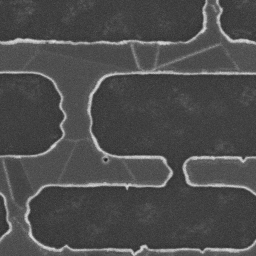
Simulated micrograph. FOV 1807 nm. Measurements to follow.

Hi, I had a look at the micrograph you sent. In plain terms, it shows one or a few lines or trenches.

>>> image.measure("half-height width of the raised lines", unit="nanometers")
229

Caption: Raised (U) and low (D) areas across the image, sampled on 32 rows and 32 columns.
DDDDDDDDDDDDDDDDDDDDDDDDDDUDDDDD
DDDDDDDDDDDDDDDDDDDDDDDDDUUUDDDD
DDDDDDDDDDDDDDDDDDDDDDDDDDUDDDDD
DDDDDDDDDDDDDDDDDDDDDDDDDUUUDDDD
DDDDDDDDDDDDDDDDDDDDDDDDUUUUDDDD
UUUUUUUUUUUUUUUUUUUUUUUUUUUUUUUU
UUUUUUUUUUUUUUUUUUUUUUUUUUUUUUUU
UUUUUUUUUUUUUUUUUUUUUUUUUUUUUUUU
UUUUUUUUUUUUUUUUUUUUUUUUUUUUUUUU
DDDDDDUUUUUUUUDDDDDDDDDDDDDDDDDD
DDDDDDDUUUUUDDDDDDDDDDDDDDDDDDDD
DDDDDDDUUUUUDDDDDDDDDDDDDDDDDDDD
DDDDDDDDUUUDDDDDDDDDDDDDDDDDDDDD
DDDDDDDDUUUDDDDDDDDDDDDDDDDDDDDD
DDDDDDDDUUUDDDDDDDDDDDDDDDDDDDDD
DDDDDDDDUUUDDDDDDDDDDDDDDDDDDDDD
DDDDDDDDUUUDDDDDDDDDDDDDDDDDDDDD
DDDDDDDUUUUUDDDDDDDDDDDDDDDDDDDD
DDDDDDUUUUUUDDDDDDDDDDDDDDDDDDDD
UUUUUUUUUUUUUUDDDDDDDDDDDDDDDDDD
UUUUUUUUUUUUUUUUUUUUUDDUUUUUUUUU
UUUUUUUUUUUUUUUUUUUUUDDUUUUUUUUU
UUUUUUUUUUUUUUUUUUUUUDDUUUUUUUUU
UUUUUDDDDDDDDDDDDDDDDDDDDDDDDDDU
UUUUDDDDDDDDDDDDDDDDDDDDDDDDDDDD
DUUUDDDDDDDDDDDDDDDDDDDDDDDDDDDD
DUUUDDDDDDDDDDDDDDDDDDDDDDDDDDDD
DUUUDDDDDDDDDDDDDDDDDDDDDDDDDDDD
DUUUDDDDDDDDDDDDDDDDDDDDDDDDDDDD
UUUUDDDDDDDDDDDDDDDDDDDDDDDDDDDD
UUUUUDDDDDDDDDDDDDDDDDDDDDDDDDDD
UUUUUUUUUUUUUUUUUUUUUUUUUUUUUUUU